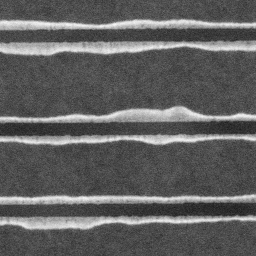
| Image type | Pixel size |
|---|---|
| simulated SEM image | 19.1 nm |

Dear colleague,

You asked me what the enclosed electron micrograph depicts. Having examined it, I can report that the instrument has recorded lines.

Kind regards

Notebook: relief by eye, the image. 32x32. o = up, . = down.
oooooooooooooooooooooooooooooooo
oooooooooooooooooooooooooooooooo
oooooooooooooooooooooooooooooooo
................................
................................
......................o.........
oooooooooooooooooooooooooooooooo
oooooooooooooooooooooooooooooooo
oooooooooooooooooooooooooooooooo
oooooooooooooooooooooooooooooooo
oooooooooooooooooooooooooooooooo
oooooooooooooooooooooooooooooooo
oooooooooooooooooooooooooooooooo
oooooooooooooooooooooooooooooooo
ooooooooooooooooo.ooo..ooooooooo
................................
................................
ooooooo.oooooooooooooooooooooooo
oooooooooooooooooooooooooooooooo
oooooooooooooooooooooooooooooooo
oooooooooooooooooooooooooooooooo
oooooooooooooooooooooooooooooooo
oooooooooooooooooooooooooooooooo
oooooooooooooooooooooooooooooooo
oooooooooooooooooooooooooooooooo
................................
................................
.............ooo.ooooooooooooooo
oooooooooooooooooooooooooooooooo
oooooooooooooooooooooooooooooooo
oooooooooooooooooooooooooooooooo
oooooooooooooooooooooooooooooooo